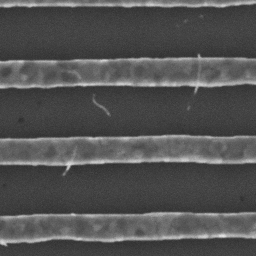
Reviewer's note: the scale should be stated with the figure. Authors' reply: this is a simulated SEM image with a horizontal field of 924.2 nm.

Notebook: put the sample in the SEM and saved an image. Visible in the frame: lines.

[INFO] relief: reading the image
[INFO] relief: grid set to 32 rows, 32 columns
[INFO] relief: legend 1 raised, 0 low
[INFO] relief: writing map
11111111111111111111111111111000
00000000000000000000000000000000
00000000000000000000000000000000
00000000000000000000000000000000
00000000000000000000000000000000
00000000000000000000000000000000
00000000000000000000000000000000
00000000000000011111111111111111
11111111111111111111111111111111
11111111111111111111111111111111
11111111111111111111111111111100
00000000000000000000000000000000
00000000000000000000000000000000
00000000000000000000000000000000
00000000000000000000000000000000
00000000000000000000000000000000
00000000000000000000000000000000
11111111111111111111111111111111
11111111111111111111111111111111
11111111111111111111111111111111
11111111110000000000000000000000
00000000000000000000000000000000
00000000000000000000000000000000
00000000000000000000000000000000
00000000000000000000000000000000
00000000000000000000000000000000
00000000000000000000000000000000
11111111111111111111111111111111
11111111111111111111111111111111
11111111111111111111111111110011
00000000000000000000000000000000
00000000000000000000000000000000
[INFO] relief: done